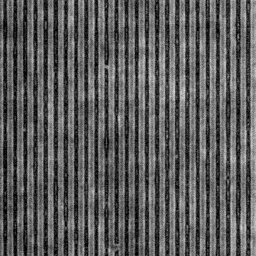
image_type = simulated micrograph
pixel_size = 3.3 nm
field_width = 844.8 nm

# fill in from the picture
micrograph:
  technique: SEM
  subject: parallel lines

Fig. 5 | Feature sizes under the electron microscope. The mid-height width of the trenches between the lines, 13.6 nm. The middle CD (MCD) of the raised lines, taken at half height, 19.8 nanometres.